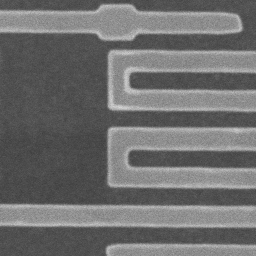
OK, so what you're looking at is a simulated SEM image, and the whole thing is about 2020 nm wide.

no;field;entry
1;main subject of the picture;wiring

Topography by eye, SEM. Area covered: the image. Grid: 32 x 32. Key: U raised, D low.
DDDDDDDDDDDDDDDDDDDDDDDDDDDDDDDD
UUUUUUUUUUUUUUUUUUDDDDDDDDDDDDDD
UUUUUUUUUUUUUUUUUUUUUUUUUUUUUUDD
UUUUUUUUUUUUUUUUUUUUUUUUUUUUUUDD
DDDDDDDDDDDDUUUUUDDDDDDDDDDDDDDD
DDDDDDDDDDDDDDDDDDDDDDDDDDDDDDDD
DDDDDDDDDDDDDDUUUUUUUUUUUUUUDDDD
DDDDDDDDDDDDDDUUUUUUUUUUUUUUUUUU
DDDDDDDDDDDDDDUUUUUUUUUUUUUUUUUU
DDDDDDDDDDDDDDUUDDDDDDDDDDDDDDDD
DDDDDDDDDDDDDDUUDDDDDDDDDDDDDDDD
DDDDDDDDDDDDDDUDUUUUUUUUUUUUUUUU
DDDDDDDDDDDDDDDDUUUUUUUUUUUUUUUU
DDDDDDDDDDDDDDUUUUUUUUUUUUUUUUUU
DDDDDDDDDDDDDDDDDDDDDDDDDDDDDDDD
DDDDDDDDDDDDDDDDDDDDDDDDDDDDDDDD
DDDDDDDDDDDDDDUUUUUUUUUUUUUUUUUU
DDDDDDDDDDDDDDUUUUUUUUUUUUUUUUUU
DDDDDDDDDDDDDDUUUUUUUUUUUUUUUUUU
DDDDDDDDDDDDDDUUDDDDDDDDDDDDDDDD
DDDDDDDDDDDDDDUUDDDDDDDDDDDDDDDD
DDDDDDDDDDDDDDUUUUUUUUUUUUUUUUUU
DDDDDDDDDDDDDDUUUUUUUUUUUUUUUUUU
DDDDDDDDDDDDDDDDDDDDDDDDDDDDUUUD
DDDDDDDDDDDDDDDDDDDDDDDDDDDDDDDD
DDDDDDDDDDDDDDDDDDDDDDDDDDDDDDDD
UUUUUUUUUUUUUUUUUUUUUUUUUUUUUUUU
UUUUUUUUUUUUUUUUUUUUUUUUUUUUUUUU
DDDDDDDDDDDDDDDDDDDDDDDDDDDDDDDD
DDDDDDDDDDDDDDDDDDDDDDDDDDDDDDDD
DDDDDDDDDDDDDDDDDDDDDDDDDDDDDDDD
DDDDDDDDDDDDDUUUUUUUUUUUUUUUUUUU